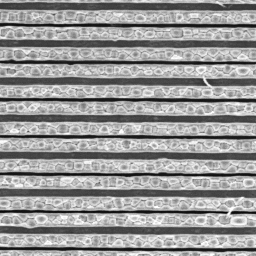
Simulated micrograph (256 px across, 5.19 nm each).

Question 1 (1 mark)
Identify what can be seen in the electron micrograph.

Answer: parallel lines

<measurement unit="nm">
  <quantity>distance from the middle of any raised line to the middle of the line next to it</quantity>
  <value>96.8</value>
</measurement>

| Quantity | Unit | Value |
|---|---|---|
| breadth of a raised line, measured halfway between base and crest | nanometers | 68.7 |